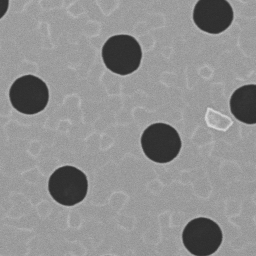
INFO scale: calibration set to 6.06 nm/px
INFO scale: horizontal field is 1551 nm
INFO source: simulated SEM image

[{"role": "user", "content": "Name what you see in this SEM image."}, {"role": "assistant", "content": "holes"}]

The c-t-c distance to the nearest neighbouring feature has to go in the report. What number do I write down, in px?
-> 97.9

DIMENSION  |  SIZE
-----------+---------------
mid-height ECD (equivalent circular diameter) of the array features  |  0.241 µm